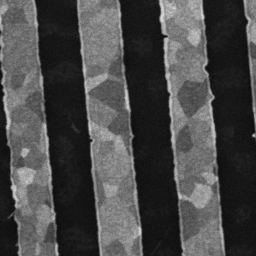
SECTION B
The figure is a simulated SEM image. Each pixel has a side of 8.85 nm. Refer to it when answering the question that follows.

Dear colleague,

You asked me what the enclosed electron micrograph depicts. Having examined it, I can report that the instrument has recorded one or a few lines or trenches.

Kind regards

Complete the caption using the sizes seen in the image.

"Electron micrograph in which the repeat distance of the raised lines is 730 nm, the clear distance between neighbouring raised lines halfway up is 42.7 pixels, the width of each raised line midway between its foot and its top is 355 nm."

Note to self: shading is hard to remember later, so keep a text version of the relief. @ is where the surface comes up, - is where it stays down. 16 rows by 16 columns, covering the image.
@@---@@---@@@--@
@@---@@@--@@@---
@@---@@@--@@@---
@@---@@@--@@@---
@@@--@@@--@@@---
@@@--@@@---@@---
@@@--@@@---@@---
@@@---@@---@@---
-@@---@@---@@---
-@@---@@---@@---
-@@---@@---@@@--
-@@---@@---@@@--
-@@---@@@--@@@--
-@@---@@@--@@@--
-@@---@@@--@@@--
-@@@--@@@--@@@--